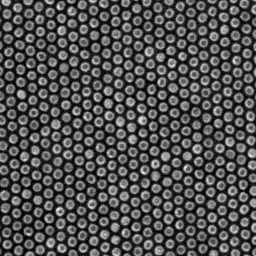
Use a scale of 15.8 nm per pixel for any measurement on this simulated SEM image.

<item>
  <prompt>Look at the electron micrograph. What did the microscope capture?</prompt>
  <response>a regular array of raised bodies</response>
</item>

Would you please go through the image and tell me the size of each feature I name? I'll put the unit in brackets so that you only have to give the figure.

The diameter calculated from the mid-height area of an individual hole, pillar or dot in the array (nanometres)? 127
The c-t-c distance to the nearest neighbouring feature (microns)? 0.19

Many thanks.